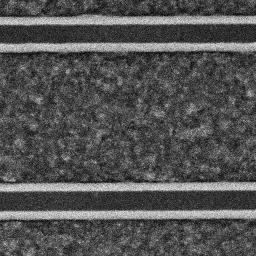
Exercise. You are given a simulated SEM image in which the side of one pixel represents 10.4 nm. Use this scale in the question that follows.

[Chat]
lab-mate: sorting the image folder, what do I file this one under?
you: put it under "one or a few lines or trenches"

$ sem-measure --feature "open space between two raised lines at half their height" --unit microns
1.46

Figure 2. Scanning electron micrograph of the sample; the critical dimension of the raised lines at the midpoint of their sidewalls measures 0.278 um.